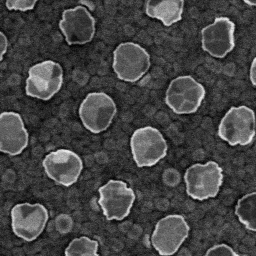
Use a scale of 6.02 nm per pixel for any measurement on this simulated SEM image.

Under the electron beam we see a regular array of raised bodies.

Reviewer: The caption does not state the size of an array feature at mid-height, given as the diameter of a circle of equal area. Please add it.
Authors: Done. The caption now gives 219 nanometres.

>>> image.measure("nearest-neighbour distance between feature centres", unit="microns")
0.374